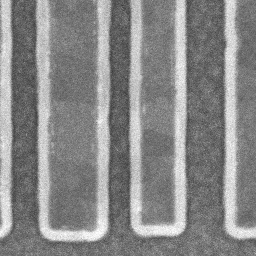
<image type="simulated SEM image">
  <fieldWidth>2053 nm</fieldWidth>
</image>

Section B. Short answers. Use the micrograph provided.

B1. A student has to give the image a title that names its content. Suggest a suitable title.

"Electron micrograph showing one or a few lines or trenches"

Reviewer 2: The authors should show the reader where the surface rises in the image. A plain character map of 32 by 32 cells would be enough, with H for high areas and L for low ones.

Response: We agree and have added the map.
HLLLLHHHHHHHHLLLLHHHHHLLLLLLLHHH
HLLLLHHHHHHHHLLLLHHHHHLLLLLLLHHH
HLLLLHHHHHHHHLLLLHHHHHLLLLLLLHHH
HLLLLHHHHHHHHLLLLHHHHHLLLLLLLHHH
HLLLLHHHHHHHHLLLLHHHHHLLLLLLLHHH
HLLLLHHHHHHHHLLLLHHHHHLLLLLLLHHH
HLLLLHHHHHHHHLLLLHHHHHLLLLLLLHHH
HLLLLHHHHHHHHLLLLHHHHHLLLLLLLHHH
HLLLLHHHHHHHHLLLLHHHHHLLLLLLLHHH
HLLLLHHHHHHHHLLLLHHHHHHLLLLLLHHH
HLLLLHHHHHHHHLLLLHHHHHHLLLLLLHHH
HLLLLLHHHHHHHLLLLHHHHHHLLLLLLHHH
HLLLLLHHHHHHHLLLLHHHHHHLLLLLLHHH
HLLLLLHHHHHHHLLLLHHHHHHLLLLLLHHH
HLLLLLHHHHHHHLLLLHHHHHHLLLLLLHHH
HLLLLLHHHHHHHLLLLHHHHHLLLLLLLHHH
HLLLLHHHHHHHHLLLLHHHHHLLLLLLLHHH
HLLLLHHHHHHHHLLLLHHHHHLLLLLLLHHH
HLLLLLHHHHHHHLLLLHHHHHLLLLLLLHHH
HLLLLLHHHHHHHLLLLHHHHHLLLLLLLHHH
HLLLLLHHHHHHHLLLLHHHHHLLLLLLLHHH
HLLLLLHHHHHHHLLLLHHHHHLLLLLLLHHH
HLLLLLHHHHHHHLLLLHHHHHLLLLLLLHHH
HLLLLLHHHHHHHLLLLHHHHHLLLLLLLHHH
HLLLLLHHHHHHHLLLLHHHHHLLLLLLLHHH
HLLLLHHHHHHHHLLLLHHHHHLLLLLLLHHH
HLLLLHHHHHHHHLLLLHHHHHLLLLLLLHHH
HLLLLLHHHHHHHLLLLHHHHHLLLLLLLHHH
LLLLLLHHHHHHHLLLLLHHHHLLLLLLLHHH
LLLLLLLLLLLLLLLLLLLLLLLLLLLLLLLL
LLLLLLLLLLLLLLLLLLLLLLLLLLLLLLLL
LLLLLLLLLLLLLLLLLLLLLLLLLLLLLLLL